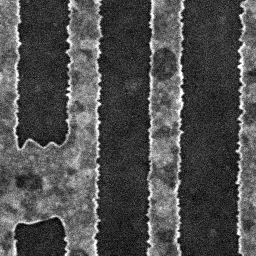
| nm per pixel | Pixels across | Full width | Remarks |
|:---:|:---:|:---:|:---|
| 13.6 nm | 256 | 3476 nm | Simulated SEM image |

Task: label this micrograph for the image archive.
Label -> one or a few lines or trenches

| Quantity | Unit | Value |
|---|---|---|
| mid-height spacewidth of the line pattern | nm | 728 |